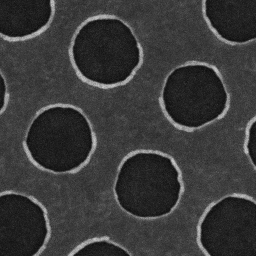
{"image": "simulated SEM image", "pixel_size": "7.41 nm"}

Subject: holes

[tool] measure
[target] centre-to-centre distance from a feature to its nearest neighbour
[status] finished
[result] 734 nanometres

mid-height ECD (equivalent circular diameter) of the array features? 487 nm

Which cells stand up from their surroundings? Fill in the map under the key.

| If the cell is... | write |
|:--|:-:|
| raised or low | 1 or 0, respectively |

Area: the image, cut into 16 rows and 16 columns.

0001111111111000
0001100011111000
1111100011111100
1111100001111111
1111100011100111
1111111111000011
1111111111000011
1100011111100111
1100001111111111
1100001111111111
1110011100011111
1111111000011111
0011111000011100
0001111110111000
0001111111111000
0001100011111000